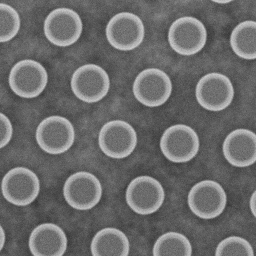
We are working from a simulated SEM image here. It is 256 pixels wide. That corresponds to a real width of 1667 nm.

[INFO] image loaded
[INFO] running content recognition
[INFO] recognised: an array of small figures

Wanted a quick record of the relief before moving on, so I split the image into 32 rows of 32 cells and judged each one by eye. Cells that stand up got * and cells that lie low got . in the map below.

................................
**.....**.......................
**....****....***.....***.......
**....****...*****...*****...***
**....****...*****...*****...***
.......**.....***....****....***
......................***....***
................................
..***.....***...................
.*****...****....****.....**....
.*****...*****...****....****...
..***....****....****....****...
..........**.....****....****...
..........................**....
*...............................
*....****....***................
*....****....****....***.....**.
*....****...*****...*****...****
.....****....****...*****...****
..............**.....***....****
.............................**.
.***............................
*****...****.....**.............
*****...*****...****....****....
.****...*****...****....****....
..*......***....****....****...*
.................**.....****....
................................
.....**.........................
*...****....****....***.........
....****...*****...*****....***.
....****....****...*****...*****